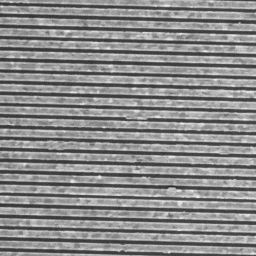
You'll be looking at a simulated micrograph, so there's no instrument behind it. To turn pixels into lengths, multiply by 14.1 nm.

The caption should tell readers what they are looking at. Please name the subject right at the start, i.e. parallel lines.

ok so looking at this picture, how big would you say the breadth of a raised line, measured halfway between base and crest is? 89.7 nanometers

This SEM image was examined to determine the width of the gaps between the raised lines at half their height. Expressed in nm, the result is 63.3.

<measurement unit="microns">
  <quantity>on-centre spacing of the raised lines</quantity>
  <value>0.157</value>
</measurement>